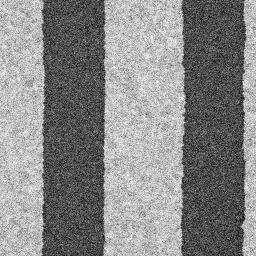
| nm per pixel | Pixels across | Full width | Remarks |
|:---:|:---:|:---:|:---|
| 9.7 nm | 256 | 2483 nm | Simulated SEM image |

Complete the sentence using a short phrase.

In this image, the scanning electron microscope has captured one or a few lines or trenches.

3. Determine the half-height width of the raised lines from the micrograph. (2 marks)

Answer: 730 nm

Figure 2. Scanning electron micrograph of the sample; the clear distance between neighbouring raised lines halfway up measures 603 nm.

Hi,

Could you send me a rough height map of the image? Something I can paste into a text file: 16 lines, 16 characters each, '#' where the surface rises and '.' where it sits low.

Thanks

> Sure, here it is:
###....####....#
###....####....#
###....####....#
###....####....#
###....####....#
###....####....#
###....#####...#
###....####....#
###....####....#
###....####....#
###....####....#
###....####....#
###....####....#
###....####....#
###....####....#
###....####....#